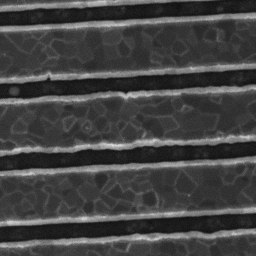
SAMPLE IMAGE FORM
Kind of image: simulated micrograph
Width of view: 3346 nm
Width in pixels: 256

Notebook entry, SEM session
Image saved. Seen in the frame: one or a few lines or trenches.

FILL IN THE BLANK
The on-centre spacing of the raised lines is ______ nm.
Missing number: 940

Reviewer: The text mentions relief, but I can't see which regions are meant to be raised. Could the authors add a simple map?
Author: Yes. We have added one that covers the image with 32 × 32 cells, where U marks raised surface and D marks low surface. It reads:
UUUUUUUUUUUUDDDDDDDDDDDDDDDDDDDD
DDDDDDDDDDDDDDDDDDDDDDDDDDDDDDDD
DDDDDDDDDDDDDDDDDDDDUUUUUUUUUUUU
DDDUUUUUUUUUUUUUUUUUUUUUUUUUUUUU
UUUUUUUUUUUUUUUUUUUUUUUUUUUUUUUU
UUUUUUUUUUUUUUUUUUUUUUUUUUUUUUUU
UUUUUUUUUUUUUUUUUUUUUUUUUUUUUUUU
UUUUUUUUUUUUUUUUUUUUUUUUUUUUUUUU
UUUUUUUUUUUUUUUUUUUUUUUUUUUUDDDD
UUUUUUUUUUUUUDDDDDDDDDDDDDDDDDDD
DDDDDDDDDDDDDDDDDDDDDDDDDDDDDDDD
DDDDDDDDDDDDDDDDDDDDDDUUUUUUUUUU
DDDDUUUUUUUUUUUUUUUUUUUUUUUUUUUU
UUUUUUUUUUUUUUUUUUUUUUUUUUUUUUUU
UUUUUUUUUUUUUUUUUUUUUUUUUUUUUUUU
UUUUUUUUUUUUUUUUUUUUUUUUUUUUUUUU
UUUUUUUUUUUUUUUUUUUUUUUUUUUUUUUU
UUUUUUUUUUUUUUUUUUUUUUUUUUUUUDDD
UUUUUUUUUUUDDDDDDDDDDDDDDDDDDDDD
DDDDDDDDDDDDDDDDDDDDDDDDDDDDDDDD
DDDDDDDDDDDDDDDDDDDDDDUUUUUUUUUU
DDDUUUUUUUUUUUUUUUUUUUUUUUUUUUUU
UUUUUUUUUUUUUUUUUUUUUUUUUUUUUUUU
UUUUUUUUUUUUUUUUUUUUUUUUUUUUUUUU
UUUUUUUUUUUUUUUUUUUUUUUUUUUUUUUU
UUUUUUUUUUUUUUUUUUUUUUUUUUUUUUUU
UUUUUUUUUUUUUUUUUUUUUUUUUUUUDDDD
UUUUUUUUUUUUDDDDDDDDDDDDDDDDDDDD
DDDDDDDDDDDDDDDDDDDDDDDDDDDDDDDD
DDDDDDDDDDDDDDDDDDDUUUUUUUUUUUUU
DDDUUUUUUUUUUUUUUUUUUUUUUUUUUUUU
UUUUUUUUUUUUUUUUUUUUUUUUUUUUUUUU